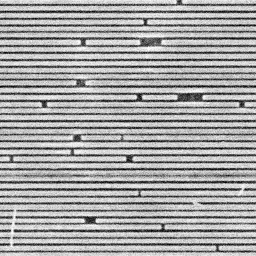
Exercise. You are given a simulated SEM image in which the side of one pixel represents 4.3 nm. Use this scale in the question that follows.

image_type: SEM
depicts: parallel lines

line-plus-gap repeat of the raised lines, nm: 29.5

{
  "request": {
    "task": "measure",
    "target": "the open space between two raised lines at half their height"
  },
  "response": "11.3 nm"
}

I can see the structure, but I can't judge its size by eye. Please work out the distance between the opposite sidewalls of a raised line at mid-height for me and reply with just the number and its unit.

19.4 nanometers